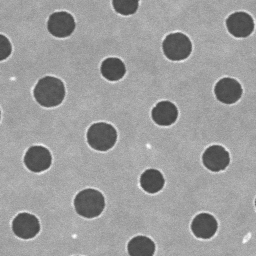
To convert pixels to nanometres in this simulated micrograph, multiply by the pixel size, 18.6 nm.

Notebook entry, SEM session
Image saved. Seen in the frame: a regular array of holes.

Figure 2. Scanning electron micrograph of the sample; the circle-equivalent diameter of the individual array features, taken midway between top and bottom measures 525 nm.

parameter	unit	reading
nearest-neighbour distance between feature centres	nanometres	1250